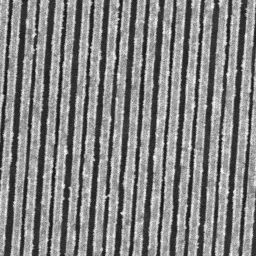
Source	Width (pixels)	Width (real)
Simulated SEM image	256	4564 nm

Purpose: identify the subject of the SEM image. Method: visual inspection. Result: parallel lines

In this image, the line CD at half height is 156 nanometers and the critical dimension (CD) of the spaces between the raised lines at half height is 86.8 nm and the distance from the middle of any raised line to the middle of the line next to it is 13.7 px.